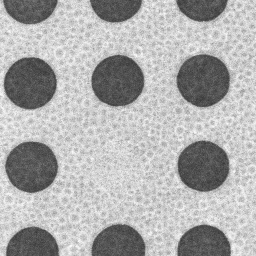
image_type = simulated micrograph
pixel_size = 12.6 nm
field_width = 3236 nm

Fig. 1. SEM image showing holes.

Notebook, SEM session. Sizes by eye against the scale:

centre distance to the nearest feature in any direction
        1080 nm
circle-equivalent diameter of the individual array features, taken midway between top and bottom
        0.661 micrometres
